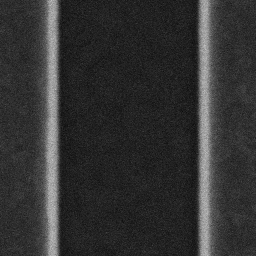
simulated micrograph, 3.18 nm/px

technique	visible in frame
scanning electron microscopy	one or a few lines or trenches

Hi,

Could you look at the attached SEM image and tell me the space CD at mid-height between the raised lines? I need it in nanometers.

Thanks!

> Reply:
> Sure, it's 480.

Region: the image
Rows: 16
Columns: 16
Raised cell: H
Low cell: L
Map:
HHHLLLLLLLLLLHHH
HHHLLLLLLLLLLHHH
HHHLLLLLLLLLLHHH
HHHLLLLLLLLLLHHH
HHHLLLLLLLLLLHHH
HHHLLLLLLLLLLHHH
HHHLLLLLLLLLLHHH
HHHLLLLLLLLLLHHH
HHHLLLLLLLLLLHHH
HHHLLLLLLLLLLHHH
HHHLLLLLLLLLLHHH
HHHLLLLLLLLLLHHH
HHHLLLLLLLLLLHHH
HHHLLLLLLLLLLHHH
HHHLLLLLLLLLLHHH
HHHLLLLLLLLLLHHH